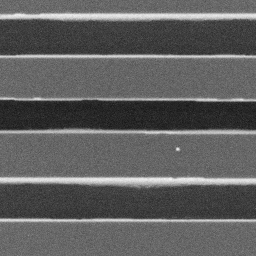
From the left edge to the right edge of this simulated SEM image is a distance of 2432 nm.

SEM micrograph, lines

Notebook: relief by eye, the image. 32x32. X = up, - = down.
XXXXXXXXXXXXXXXXXXXXXXXXXXXXXXXX
XXXXXXXXXXXXXXXXXXXXXXXXXXXXXXXX
--------------------------------
--------------------------------
--------------------------------
--------------------------------
--------------------------------
XXXXXXXXXXXXXXXXXXXXXXXXXXXXXXXX
XXXXXXXXXXXXXXXXXXXXXXXXXXXXXXXX
XXXXXXXXXXXXXXXXXXXXXXXXXXXXXXXX
XXXXXXXXXXXXXXXXXXXXXXXXXXXXXXXX
XXXXXXXXXXXXXXXXXXXXXXXXXXXXXXXX
--------------------------------
--------------------------------
--------------------------------
--------------------------------
--------------------------------
XXXXXXXXXXXXXXXXXXXXXXXXXXXXXXXX
XXXXXXXXXXXXXXXXXXXXXXXXXXXXXXXX
XXXXXXXXXXXXXXXXXXXXXXXXXXXXXXXX
XXXXXXXXXXXXXXXXXXXXXXXXXXXXXXXX
XXXXXXXXXXXXXXXXXXXXXXXXXXXXXXXX
--------------------------------
--------------------------------
--------------------------------
--------------------------------
--------------------------------
--------------------------------
XXXXXXXXXXXXXXXXXXXXXXXXXXXXXXXX
XXXXXXXXXXXXXXXXXXXXXXXXXXXXXXXX
XXXXXXXXXXXXXXXXXXXXXXXXXXXXXXXX
XXXXXXXXXXXXXXXXXXXXXXXXXXXXXXXX